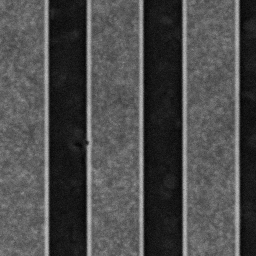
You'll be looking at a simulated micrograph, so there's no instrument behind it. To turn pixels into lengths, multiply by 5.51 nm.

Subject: one or a few lines or trenches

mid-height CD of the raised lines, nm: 290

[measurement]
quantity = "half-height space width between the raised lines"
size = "235 nanometres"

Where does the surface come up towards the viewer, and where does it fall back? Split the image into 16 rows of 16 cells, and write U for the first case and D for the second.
UUUDDDUUUDDDUUUD
UUUDDDUUUDDDUUUD
UUUDDDUUUDDDUUUD
UUUDDDUUUDDDUUUD
UUUDDDUUUDDDUUUD
UUUDDDUUUDDDUUUD
UUUDDDUUUDDDUUUD
UUUDDDUUUDDDUUUD
UUUDDDUUUDDDUUUD
UUUDDDUUUDDDUUUD
UUUDDDUUUDDDUUUD
UUUDDDUUUDDDUUUD
UUUDDDUUUDDDUUUD
UUUDDDUUUDDDUUUD
UUUDDDUUUDDDUUUD
UUUDDDUUUDDDUUUD